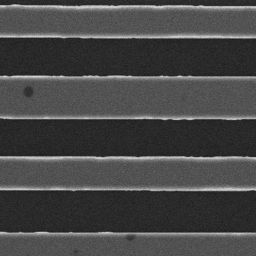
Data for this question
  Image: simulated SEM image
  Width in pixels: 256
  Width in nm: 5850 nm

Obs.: lines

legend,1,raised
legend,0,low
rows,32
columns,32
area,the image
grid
00000000000000000000000000000000
11111111111111111111111111111111
11111111111111111111111111111111
11111111111111111111111111111111
11111111111111111111111111111111
00000000000000000000000000000000
00000000000000000000000000000000
00000000000000000000000000000000
00000000000000000000000000000000
00000000000000000000000000000000
11111111111111111111111111111111
11111111111111111111111111111111
11111111111111111111111111111111
11111111111111111111111111111111
11111111111111111111111111111111
00000000000000000000000000000000
00000000000000000000000000000000
00000000000000000000000000000000
00000000000000000000000000000000
00000000000000000000000000000000
11111111111111111111111111111111
11111111111111111111111111111111
11111111111111111111111111111111
11111111111111111111111111111111
00000000000000000000000000000000
00000000000000000000000000000000
00000000000000000000000000000000
00000000000000000000000000000000
00000000000000000000000000000000
11111111111111111111111111111111
11111111111111111111111111111111
11111111111111111111111111111111